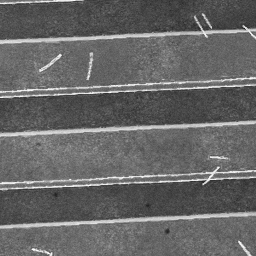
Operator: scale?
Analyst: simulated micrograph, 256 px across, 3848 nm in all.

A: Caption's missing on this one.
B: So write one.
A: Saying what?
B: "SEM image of lines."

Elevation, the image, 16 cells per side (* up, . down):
................
................
....************
****************
****************
*************...
................
................
****************
****************
****************
*******.........
................
..............**
****************
****************